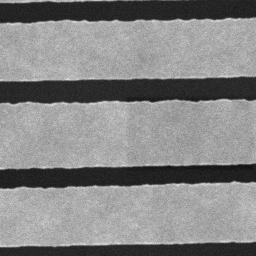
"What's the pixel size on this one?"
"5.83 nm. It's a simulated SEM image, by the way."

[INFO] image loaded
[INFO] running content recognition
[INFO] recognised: lines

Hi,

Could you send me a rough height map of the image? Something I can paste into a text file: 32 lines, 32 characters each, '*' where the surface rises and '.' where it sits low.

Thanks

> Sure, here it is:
................................
................................
......................*.********
********************************
********************************
********************************
********************************
********************************
********************************
********************************
................................
................................
...........................****.
********************************
********************************
********************************
********************************
********************************
********************************
********************************
******************************..
................................
................................
..**....************************
********************************
********************************
********************************
********************************
********************************
********************************
**************..................
................................